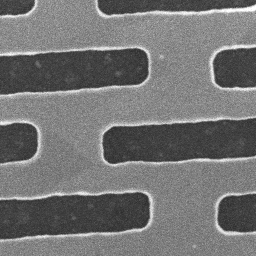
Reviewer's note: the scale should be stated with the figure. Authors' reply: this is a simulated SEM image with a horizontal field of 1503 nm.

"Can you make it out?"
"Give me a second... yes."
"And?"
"holes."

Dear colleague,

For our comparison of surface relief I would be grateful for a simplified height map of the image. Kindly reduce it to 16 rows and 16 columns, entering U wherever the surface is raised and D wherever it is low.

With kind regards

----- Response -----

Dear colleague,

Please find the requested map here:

DDUUUUDDDDDDDDDU
UUUUUUUUUUUUUUUU
UUUUUUUUUUUUUUUU
DDDDDDDDDUUUUDDD
DDDDDDDDDUUUUDDD
DDDDDDUUUUUUUUDD
UUUUUUUUUUUUUUUU
UUUUUUUUUUUUUUDD
DDUUUUDDDDDDDDDD
DDUUUUDDDDDDDDDD
UUUUUUUUUUUUUUUU
UUUUUUUUUUUUUUUU
DDDDDDDDDUUUUUDD
DDDDDDDDDUUUUUDD
DDDDDDDDUUUUUUDD
UUUUUUUUUUUUUUUU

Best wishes